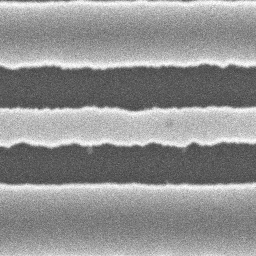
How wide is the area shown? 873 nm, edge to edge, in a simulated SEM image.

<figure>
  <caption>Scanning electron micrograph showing lines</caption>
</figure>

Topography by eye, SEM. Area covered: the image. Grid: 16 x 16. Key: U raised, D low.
UUUUUUUUUUUUUUUU
UUUUUUUUUUUUUUUU
UUUUUUUUUUUUUUUU
UUUUUUUUUUUUUUUU
DDDDDDDDDDDDDDDD
DDDDDDDDDDDDDDDD
DDDDDDDDDDDDDDDD
UUUUUUUUUUUUUUUU
UUUUUUUUUUUUUUUU
DDDDDDDDDDDDDDDD
DDDDDDDDDDDDDDDD
DDDDDDDDDDDDDDDD
UUUUUUUUUUUUUUUU
UUUUUUUUUUUUUUUU
UUUUUUUUUUUUUUUU
UUUUUUUUUUUUUUUU